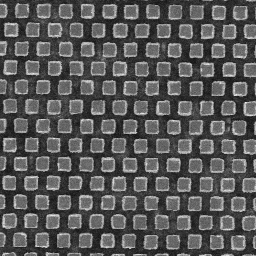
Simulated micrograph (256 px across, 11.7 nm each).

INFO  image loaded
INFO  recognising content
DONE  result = a regular array of raised bodies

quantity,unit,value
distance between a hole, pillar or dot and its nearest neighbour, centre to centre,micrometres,0.252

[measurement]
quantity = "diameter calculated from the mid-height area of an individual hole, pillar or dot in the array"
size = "171 nanometres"